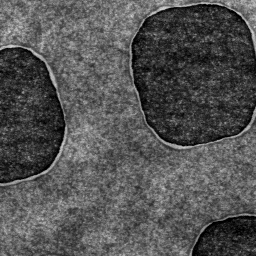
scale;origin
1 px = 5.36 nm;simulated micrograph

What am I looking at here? holes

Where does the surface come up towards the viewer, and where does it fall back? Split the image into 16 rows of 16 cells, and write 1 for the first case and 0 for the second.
1111111111100011
1111111110000001
1111111100000000
0011111100000000
0001111100000000
0001111100000000
0000111110000000
0000111110000000
0000111111000001
0000111111111111
0001111111111111
1111111111111111
1111111111111111
1111111111111110
1111111111111000
1111111111110000